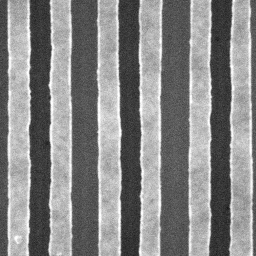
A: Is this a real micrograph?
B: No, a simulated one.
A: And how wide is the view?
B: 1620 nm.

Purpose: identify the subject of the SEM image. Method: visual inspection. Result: lines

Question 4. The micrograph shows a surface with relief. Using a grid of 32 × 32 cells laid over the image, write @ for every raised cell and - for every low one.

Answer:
-@@@--@@@---@@@---@@----@@---@@-
-@@@--@@@---@@@--@@@----@@---@@-
-@@@--@@@---@@@--@@@----@@---@@-
-@@@--@@@---@@@--@@@----@@---@@-
-@@@--@@@---@@@---@@----@@---@@-
-@@@---@@---@@@--@@@----@@---@@-
-@@@---@@---@@@--@@@----@@---@@-
-@@@--@@@---@@@--@@@----@@---@@-
-@@@--@@@---@@@--@@@----@@---@@-
-@@@--@@@---@@@---@@----@@---@@-
-@@@--@@@---@@@--@@@----@@---@@-
-@@@--@@@---@@@---@@----@@---@@-
-@@@--@@@---@@@---@@----@@---@@-
-@@@--@@@---@@@---@@----@@---@@-
-@@@--@@@---@@@---@@----@@---@@-
-@@@--@@@---@@@---@@----@@---@@-
-@@@--@@@---@@@---@@----@@---@@-
-@@@--@@@---@@@---@@----@@---@@-
-@@@--@@@---@@@---@@----@@---@@-
-@@@--@@@---@@@---@@----@@---@@-
-@@@--@@@---@@@---@@----@@---@@-
-@@@--@@@---@@@---@@----@@---@@-
-@@@--@@@---@@@---@@----@@---@@-
-@@@--@@@---@@@---@@----@@---@@-
-@@@--@@@---@@@---@@----@@---@@-
-@@@--@@@---@@@---@@----@@---@@-
-@@@--@@@---@@@---@@----@@---@@-
-@@@--@@@---@@@---@@----@@---@@-
-@@@--@@@---@@@---@@----@@---@@-
-@@@--@@@---@@@---@@----@@---@@-
-@@@--@@@---@@@--@@@----@@---@@-
-@@@--@@@---@@@--@@@----@@---@@-